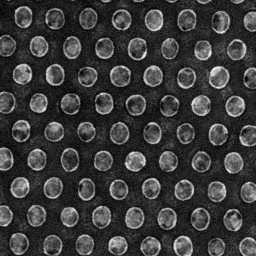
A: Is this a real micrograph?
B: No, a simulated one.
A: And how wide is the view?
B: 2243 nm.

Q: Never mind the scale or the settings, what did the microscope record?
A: a regular array of raised bodies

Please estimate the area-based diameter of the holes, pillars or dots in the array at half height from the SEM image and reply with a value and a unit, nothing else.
166 nm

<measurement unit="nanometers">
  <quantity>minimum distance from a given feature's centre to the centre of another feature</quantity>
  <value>281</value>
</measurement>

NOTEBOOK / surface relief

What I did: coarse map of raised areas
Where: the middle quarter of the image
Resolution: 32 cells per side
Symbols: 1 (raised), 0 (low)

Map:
00000000000000000000000000000000
00001110000011110000011100000111
00001111000011111000111100000111
00001111000011111000111110000111
00001111000011110000111100000111
00000100000001100000000000000111
00000000000000000000000000000000
00000000011000000000000000000000
11110000111100001111000001110000
11110000111100001111000011110000
11110000111100001111000011111000
11100000111100001111000011110000
00000000000000000110000001110000
00000000000000000000000000000000
00000000000000000000000000000000
00001110000011100000011100000111
00011111000011110000111100000111
00001111000011110000111100001111
00001110000011110000111100000111
00000000000001100000011000000010
00000000000000000000000000000000
11100000000000000000000000000000
11100000111000001110000001100000
11100000111100001111000011110000
11110000111100001111000011110000
11100000111100001111000011110000
11000000011000000110000001100000
00000000000000000000000000000000
00000000000000000000000000000000
00001110000011100000111000000110
00001111000011110000111100001111
00001111000011110000111100001111